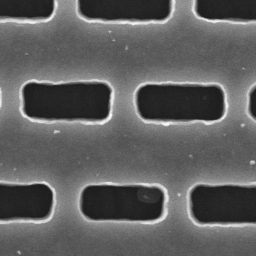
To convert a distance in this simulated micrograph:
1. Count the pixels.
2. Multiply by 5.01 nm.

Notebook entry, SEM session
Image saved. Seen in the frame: holes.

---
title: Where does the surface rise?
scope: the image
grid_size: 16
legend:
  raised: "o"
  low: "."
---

...oo......o....
oooooooooooooooo
oooooooooooooooo
oooooooooooooooo
oooooooooooooooo
oo.....oo.....oo
o......oo.....oo
oooo..oooo...ooo
oooooooooooooooo
oooooooooooooooo
oooooooooooooooo
oooooooooooooooo
...oo.....oo....
...oo.....oo....
oooooooooooooooo
oooooooooooooooo